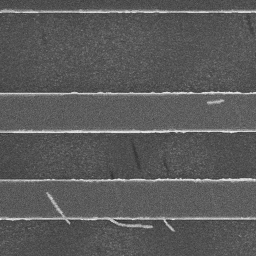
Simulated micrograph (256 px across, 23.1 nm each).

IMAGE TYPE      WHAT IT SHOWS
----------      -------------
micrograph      lines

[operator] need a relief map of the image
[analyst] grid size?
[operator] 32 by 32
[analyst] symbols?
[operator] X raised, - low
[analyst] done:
XXXXXXXXXXXXXXXXXXXXXXXXXXXXXXXX
--------------------------------
--------------------------------
--------------------------------
--------------------------------
--------------------------------
--------------------------------
--------------------------------
--------------------------------
--------------------------------
--------------------------------
--------------------------------
XXXXXXXXXXXXXXXXXXXXXXXXXXXXXXXX
XXXXXXXXXXXXXXXXXXXXXXXXXXXXXXXX
XXXXXXXXXXXXXXXXXXXXXXXXXXXXXXXX
XXXXXXXXXXXXXXXXXXXXXXXXXXXXXXXX
--------------------------------
--------------------------------
--------------------------------
--------------------------------
--------------------------------
--------------------------------
--------------XXXX-XXXXXX--XX-XX
XXXXXXXXXXXXXXXXXXXXXXXXXXXXXXXX
XXXXXXXXXXXXXXXXXXXXXXXXXXXXXXXX
XXXXXXXXXXXXXXXXXXXXXXXXXXXXXXXX
XXXXXXXXXXXXXXXXXXXXXXXXXXXXXXXX
--------------X-----X-----------
--------------------------------
--------------------------------
--------------------------------
--------------------------------